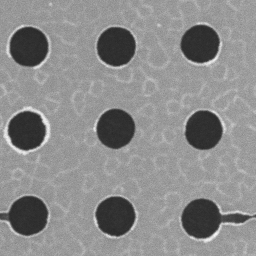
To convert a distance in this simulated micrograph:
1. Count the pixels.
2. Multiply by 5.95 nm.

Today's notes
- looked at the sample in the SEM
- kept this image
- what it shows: a regular array of holes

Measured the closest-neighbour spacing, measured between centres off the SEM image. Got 503 nm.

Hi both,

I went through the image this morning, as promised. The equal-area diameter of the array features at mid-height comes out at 0.236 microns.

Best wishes